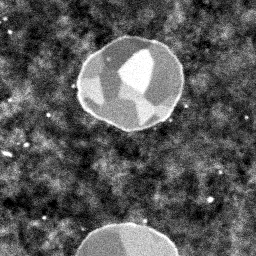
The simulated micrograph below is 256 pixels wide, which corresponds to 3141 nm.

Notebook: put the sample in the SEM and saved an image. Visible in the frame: raised bodies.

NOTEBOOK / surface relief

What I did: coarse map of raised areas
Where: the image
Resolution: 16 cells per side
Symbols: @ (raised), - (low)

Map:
----------------
----------------
-------@@-------
------@@@@@-----
-----@@@@@@-----
-----@@@@@@-----
-----@@@@@@-----
------@@@@------
----------------
----------------
-------------@--
----------------
----------------
----------------
------@@@@------
-----@@@@@@-----